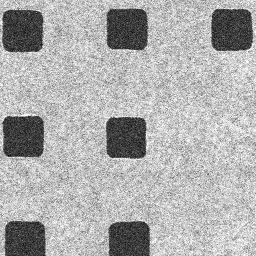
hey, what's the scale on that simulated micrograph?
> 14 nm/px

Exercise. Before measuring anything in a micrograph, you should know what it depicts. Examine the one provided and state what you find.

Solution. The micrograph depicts holes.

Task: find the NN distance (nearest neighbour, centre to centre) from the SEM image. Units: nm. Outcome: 1470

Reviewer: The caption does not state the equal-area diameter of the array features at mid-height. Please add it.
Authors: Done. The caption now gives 646 nm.